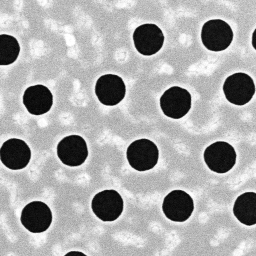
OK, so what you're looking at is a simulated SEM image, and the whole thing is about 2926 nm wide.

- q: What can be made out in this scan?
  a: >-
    a regular array of holes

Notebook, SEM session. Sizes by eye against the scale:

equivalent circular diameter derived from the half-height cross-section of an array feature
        366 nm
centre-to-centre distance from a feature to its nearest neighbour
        705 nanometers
